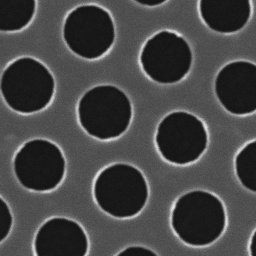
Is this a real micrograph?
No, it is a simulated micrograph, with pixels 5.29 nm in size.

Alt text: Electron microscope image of holes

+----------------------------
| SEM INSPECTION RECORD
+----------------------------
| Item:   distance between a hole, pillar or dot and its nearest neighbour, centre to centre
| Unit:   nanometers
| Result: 431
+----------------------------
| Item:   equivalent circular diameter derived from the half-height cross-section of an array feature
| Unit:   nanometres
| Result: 276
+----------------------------